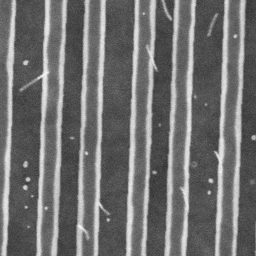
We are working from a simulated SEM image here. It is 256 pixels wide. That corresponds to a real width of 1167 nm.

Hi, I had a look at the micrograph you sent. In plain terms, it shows lines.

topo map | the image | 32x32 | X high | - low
XX----XX---XX----XX---XX----XX--
XX----XX---XX----XX---XX----XX--
XX----XX---XX----XX---XX----XX--
XX----XX---XX----XX---XX----XX--
XX----XX---XX----XX---XX----XX--
XX----XX---XX----XX---XX----XX--
X-----XX---XX----XX---XX----XX--
X-----XX---XX----XX---XX----XX--
X-----XX---XX----XX---XX----XX--
X----XXX--XXX----XX---XX----XX--
X-----XX--XXX----XX---XX----XX--
X----XXX--XXX----XX---XX----XX--
X----XXX--XXX----XX---XX----XX--
X----XXX--XXX----XX---XX----XX--
X----XXX--XXX----XX--XXX----XX--
X----XX---XXX----XX--XXX----XX--
X----XX---XXX---XXX--XXX----XX--
X----XX---XXX---XXX--XXX----XX--
X----XX---XX----XXX--XX-----XX--
X----XX---XX----XXX--XX----XXX--
X----XX---XX----XXX--XX----XXX--
X----XX---XX----XXX--XX----XXX--
X----XX---XX----XXX--XX----XXX--
X----XX---XX----XX---XX----XXX--
X----XX---XX----XX---XX----XXX--
X----XX---XX----XX---XX----XXX--
X----XX---XX----XX---XX----XXX--
X----XX---XX----XX---XX----XXX--
X----XX---XX----XX---XX----XXX--
X----XX---XX----XX---XX----XXX--
X----XX---XX----XX---XX----XX---
X----XX---XX----XX---XX----XX---